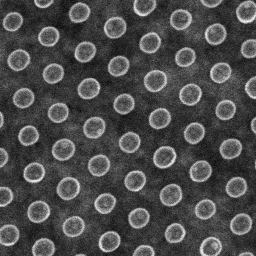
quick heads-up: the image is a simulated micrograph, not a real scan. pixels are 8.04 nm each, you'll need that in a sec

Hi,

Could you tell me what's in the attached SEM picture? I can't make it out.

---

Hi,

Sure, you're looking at a regular array of raised bodies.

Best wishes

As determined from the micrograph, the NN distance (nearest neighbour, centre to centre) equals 302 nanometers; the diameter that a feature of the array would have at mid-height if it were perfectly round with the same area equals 163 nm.